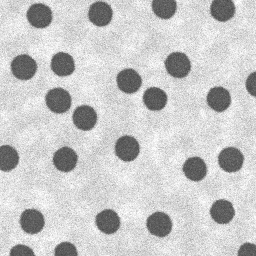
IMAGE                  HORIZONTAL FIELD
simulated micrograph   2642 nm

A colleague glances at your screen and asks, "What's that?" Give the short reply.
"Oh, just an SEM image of a regular array of holes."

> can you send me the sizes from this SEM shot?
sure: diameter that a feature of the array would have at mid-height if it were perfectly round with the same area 0.262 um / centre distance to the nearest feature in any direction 0.45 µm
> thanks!